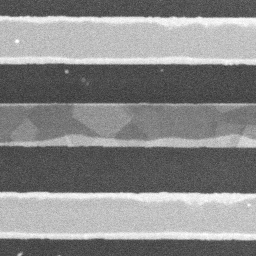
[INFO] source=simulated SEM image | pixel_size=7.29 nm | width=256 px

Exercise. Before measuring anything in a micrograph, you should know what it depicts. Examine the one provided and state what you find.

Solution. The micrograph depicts lines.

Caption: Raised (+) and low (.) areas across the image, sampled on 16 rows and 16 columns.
................
++++++++++++++++
++++++++++++++++
++++++++++++++++
................
................
................
++++++++++++++++
++++++++++++++++
................
................
................
++++++++++++++++
++++++++++++++++
++++++++++++++++
................